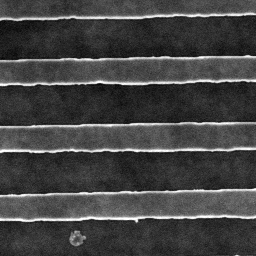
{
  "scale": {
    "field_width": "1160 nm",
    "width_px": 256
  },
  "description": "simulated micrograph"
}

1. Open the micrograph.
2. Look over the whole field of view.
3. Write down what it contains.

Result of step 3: lines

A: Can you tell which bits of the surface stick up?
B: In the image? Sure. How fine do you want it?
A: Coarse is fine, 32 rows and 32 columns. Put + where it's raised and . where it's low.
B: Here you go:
++++++++++++++++++++++++++++++++
++++++++++++++++++++++++++++++++
..+.............................
................................
................................
................................
................................
..++++++++++++++++++++++++++++++
++++++++++++++++++++++++++++++++
++++++++++++++++++++++++++++++++
+++++++++......++++.............
................................
................................
................................
................................
................++++++++++++++++
++++++++++++++++++++++++++++++++
++++++++++++++++++++++++++++++++
++++++++++++++++++++++++++++++++
................................
................................
................................
................................
................................
++++++++++++++++++++++++++++++++
++++++++++++++++++++++++++++++++
++++++++++++++++++++++++++++++++
++++++++++......................
................................
................................
................................
................................